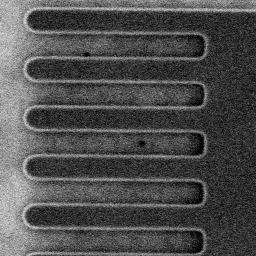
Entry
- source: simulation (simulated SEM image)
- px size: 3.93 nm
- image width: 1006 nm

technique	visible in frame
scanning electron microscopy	groups of lines, slits or small figures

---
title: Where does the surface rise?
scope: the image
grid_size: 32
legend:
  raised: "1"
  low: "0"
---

00000000000000000000000000000000
00001111111111111111111111111111
00011111111111111111111111111111
00011111111111111111111111111111
00000000000000000000000001111111
00000000000000000000000000111111
00000000000000000000000000111111
00001111111111111111111111111111
00011111111111111111111111111111
00011111111111111111111111111111
00000000000000000000000011111111
00000000000000000000000000111111
00000000000000000000000000111111
00001111111111111111111111111111
00011111111111111111111111111111
00011111111111111111111111111111
00000000000000000000000011111111
00000000000000000000000000111111
00000000000000000000000000111111
00001111111111111111110011111111
00011111111111111111111111111111
00011111111111111111111111111111
00000000011111111111111111111111
00000000000000000000000001111111
00000000000000000000000000111111
00001111111000000000000001111111
00011111111111111111111111111111
00011111111111111111111111111111
00001111111111111111111111111111
00000000000000000000000001111111
00000000000000000000000001111111
00000000000000000000000001111111